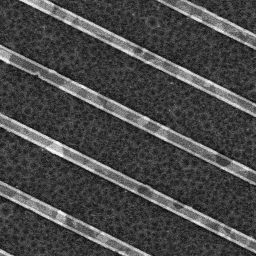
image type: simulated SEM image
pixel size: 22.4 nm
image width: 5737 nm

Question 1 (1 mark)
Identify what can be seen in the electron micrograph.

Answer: one or a few lines or trenches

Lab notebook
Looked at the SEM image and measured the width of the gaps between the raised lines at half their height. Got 51.5 pixels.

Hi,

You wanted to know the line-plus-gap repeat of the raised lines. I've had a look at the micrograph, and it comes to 1370 nm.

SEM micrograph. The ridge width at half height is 218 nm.